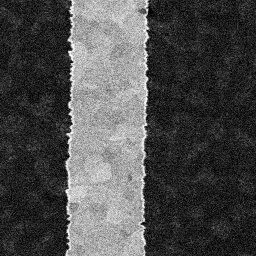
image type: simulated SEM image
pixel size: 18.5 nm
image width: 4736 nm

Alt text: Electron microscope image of one or a few lines or trenches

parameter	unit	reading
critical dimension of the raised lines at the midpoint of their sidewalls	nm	1390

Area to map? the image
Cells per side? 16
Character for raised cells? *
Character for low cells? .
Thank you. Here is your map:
....*****.......
.....****.......
....*****.......
....*****.......
....*****.......
.....****.......
....*****.......
....*****.......
....*****.......
....*****.......
....*****.......
....*****.......
....*****.......
....*****.......
....*****.......
....*****.......